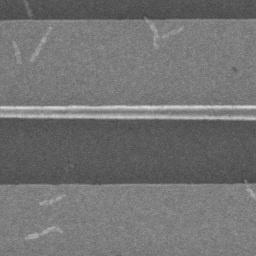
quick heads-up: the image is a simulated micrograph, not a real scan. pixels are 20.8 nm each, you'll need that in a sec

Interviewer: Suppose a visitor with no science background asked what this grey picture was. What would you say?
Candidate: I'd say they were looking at lines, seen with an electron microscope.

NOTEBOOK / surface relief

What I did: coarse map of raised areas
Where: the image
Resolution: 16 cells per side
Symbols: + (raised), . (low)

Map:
................
++++++++++++++++
++++++++++++++++
++++++++++++++++
++++++++++++++++
++++++++++++++++
++++++++++++++++
................
................
................
................
...............+
++++++++++++++++
++++++++++++++++
++++++++++++++++
++++++++++++++++